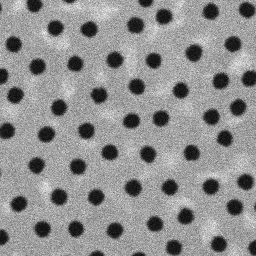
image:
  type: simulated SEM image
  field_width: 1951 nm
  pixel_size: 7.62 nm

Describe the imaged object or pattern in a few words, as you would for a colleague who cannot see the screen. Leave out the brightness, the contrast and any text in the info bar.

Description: a regular array of holes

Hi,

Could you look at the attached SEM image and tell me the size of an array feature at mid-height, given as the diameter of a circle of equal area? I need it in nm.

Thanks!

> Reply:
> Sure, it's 126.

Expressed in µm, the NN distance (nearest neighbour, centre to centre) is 0.251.